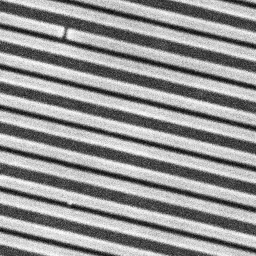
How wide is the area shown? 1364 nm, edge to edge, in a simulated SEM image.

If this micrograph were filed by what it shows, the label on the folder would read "parallel lines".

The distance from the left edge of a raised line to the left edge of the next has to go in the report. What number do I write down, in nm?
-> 106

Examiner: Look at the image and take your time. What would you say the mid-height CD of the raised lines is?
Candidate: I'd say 0.0519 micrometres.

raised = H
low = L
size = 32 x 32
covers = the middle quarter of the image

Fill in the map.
LLLLLLLLLLLHHHHHHHHHHHLLLLLLLLHH
HLLLLLLLLLLLLLLHHHHHHHHHHHLLLLLL
HHHHHHLLLLLLLLLLLLLHHHHHHHHHHHLL
HHHHHHHHHHLLLLLLLLLLLLLLHHHHHHHH
LLLLHHHHHHHHHHLLLLLLLLLLLLLLHHHH
LLLLLLLHHHHHHHHHHHLLLLLLLLLLLLLL
HHHHHLLLLLLLHHHHHHHHHHLLLLLLLLLL
HHHHHHHHHLLLLLLLHHHHHHHHHHLLLLLL
LLLHHHHHHHHHHLLLLLLLHHHHHHHHHHLL
LLLLLLLHHHHHHHHHHLLLLLLLHHHHHHHH
LLLLLLLLLLLHHHHHHHHHHLLLLLLLLHHH
HLLLLLLLLLLLLLLHHHHHHHHHHLLLLLLL
HHHHHLLLLLLLLLLLLLLHHHHHHHHHHLLL
HHHHHHHHHLLLLLLLLLLLLLLHHHHHHHHH
LLLHHHHHHHHHHLLLLLLLLLLLLLLLHHHH
LLLLLLLHHHHHHHHHHLLLLLLLLLLLLLLL
HHHHLLLLLLLHHHHHHHHHHLLLLLLLLLLL
HHHHHHHHLLLLLLLHHHHHHHHHHLLLLLLL
LLHHHHHHHHHHLLLLLLLHHHHHHHHHHLLL
LLLLLLHHHHHHHHHHLLLLLLLLHHHHHHHH
LLLLLLLLLLHHHHHHHHHHLLLLLLLLHHHH
LLLLLLLLLLLLLLHHHHHHHHHHLLLLLLLL
HHHHLLLLLLLLLLLLLLHHHHHHHHHHLLLL
HHHHHHHHLLLLLLLLLLLLLLLHHHHHHHHH
LLHHHHHHHHHHLLLLLLLLLLLLLLLHHHHH
LLLLLLHHHHHHHHHHLLLLLLLLLLLLLLLH
HHHLLLLLLLHHHHHHHHHHLLLLLLLLLLLL
HHHHHHHLLLLLLLHHHHHHHHHHLLLLLLLL
LHHHHHHHHHHLLLLLLLHHHHHHHHHHLLLL
LLLLLHHHHHHHHHHLLLLLLLLHHHHHHHHH
LLLLLLLLLHHHHHHHHHHLLLLLLLLHHHHH
LLLLLLLLLLLLLHHHHHHHHHHLLLLLLLLH